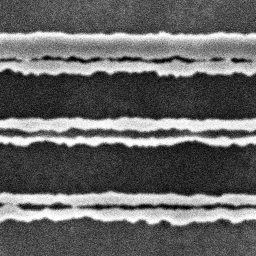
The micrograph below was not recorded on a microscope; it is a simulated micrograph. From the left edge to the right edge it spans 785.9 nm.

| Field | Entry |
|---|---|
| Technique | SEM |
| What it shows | lines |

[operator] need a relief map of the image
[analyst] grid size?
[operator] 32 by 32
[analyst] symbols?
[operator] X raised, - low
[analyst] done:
--------------------------------
--------------------------------
--------------------------------
--------------------------------
XXXXXXXXXXXXXXXXXXXXXXXXXXXXXXXX
XXXXXXXXXXXXXXXXXXXXXXXXXXXXXXXX
XXXXXXXXXXXXXXXXXXXXXXXXXXXXXXXX
XXXXXXXXXXXXXXXXXXXXXXXXXXXXXXXX
XXXXXXXXXXXXXXXXXXXXXXXXXXXXXXXX
--------------------------------
--------------------------------
--------------------------------
--------------------------------
--------------------------------
--------------------------------
XXXXXXXXXXXXXXXXXXXXXXXXXXXXXXXX
XXXXXXXXXXXXXXXXXXXXXXXXXXXXXXXX
XXXXXXXXXXXXXXXXXXXXXXXXXXXXXXXX
--------------------------------
--------------------------------
--------------------------------
--------------------------------
--------------------------------
--------------------------------
XXXXXXXXXXXXXXXXXXXXXXX-XX--XXXX
XXXXXXXXXXXXXXXXXXXXXXXXXXXXXXXX
XXXXXXXXXXXXXXXXXXXXXXXXXXXXXXXX
---X---------X--X-XX-XXXXXX--X--
--------------------------------
--------------------------------
--------------------------------
--------------------------------